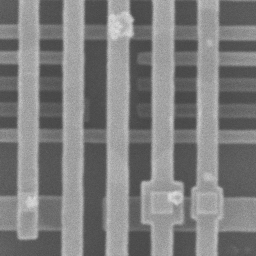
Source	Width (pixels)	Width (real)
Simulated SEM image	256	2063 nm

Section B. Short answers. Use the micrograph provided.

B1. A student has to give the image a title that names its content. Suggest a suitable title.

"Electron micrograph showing wiring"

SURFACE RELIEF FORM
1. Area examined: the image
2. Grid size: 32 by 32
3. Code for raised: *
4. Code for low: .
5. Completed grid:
..***...**....**...***...**.....
..***...**....**...***...**.....
..***...**....***..***...**.....
..***...**....***..***...**.....
..***...**....**...***...**.....
..***...**....**...***...**.....
..***...**....**...***...**.....
..***...**...***...***...**.....
..***...**...***...***...**.....
..***...**...***...***...**.....
..***...**...***...***...**.....
..***...**...***...***...**.....
..***...**...***...***...**.....
..***...**...***...***...**.....
..***...**...***...***...**.....
..***...**...***...***...**.....
..***...**...***...***...**.....
..***...**...***...***...**.....
..***...**...***...***...**.....
..***...**...***...***...**.....
..***...**...***...***...**.....
..***...**...***...***...**.....
..***...**...***...***...**.....
..***...**...***..*****.***.....
..***...**...***..*****.****....
..***...**...***..*****.****....
..***...**...***..*****.****....
..***...**...***..*****.***.....
..***...**...***...***...**.....
..***...**...***...***...**.....
........**...***...***...**.....
........**...***...***...**.....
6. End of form